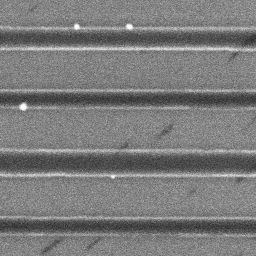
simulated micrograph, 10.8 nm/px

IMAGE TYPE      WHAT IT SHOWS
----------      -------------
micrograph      lines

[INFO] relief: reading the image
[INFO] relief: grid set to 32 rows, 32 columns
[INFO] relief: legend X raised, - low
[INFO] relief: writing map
--------------------------------
--------------------------------
--------------------------------
XXX------X-----XX---------------
XXXXXXXXXXXXXXXXXXXXXXXXXXXXXXXX
XXXXXXXXXXXXXXXXXXXXXXXXXXXXXXXX
--------------------------------
--------------------------------
--------------------------------
--------------------------------
--------------------------------
XXXXXXXXXXXXXXXXXXXXXXXXXXXXXXXX
XXXXXXXXXXXXXXXXXXXXXXXXXXXXXXXX
--XX---------------------XXXXXXX
--------------------------------
--------------------------------
--------------------------------
--------------------------------
--------------------------------
XXXXXXXXXXXXXXXXXXXXXXXXXXXXXXXX
XXXXXXXXXXXXXXXXXXXXXXXXXXXXXXXX
XXXXXXXXXXXXXXXXXXXXXXXXXXXXXXXX
--------------------------------
--------------------------------
--------------------------------
--------------------------------
--------------------------------
XXXXXXXXXXXXXXXXXXXXXXXXXXXXXXXX
XXXXXXXXXXXXXXXXXXXXXXXXXXXXXXXX
--------------------------------
--------------------------------
--------------------------------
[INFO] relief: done